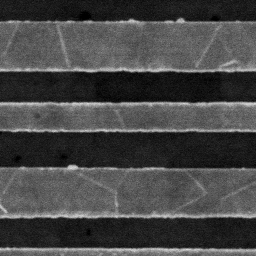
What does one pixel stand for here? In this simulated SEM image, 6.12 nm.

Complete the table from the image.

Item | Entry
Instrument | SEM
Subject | lines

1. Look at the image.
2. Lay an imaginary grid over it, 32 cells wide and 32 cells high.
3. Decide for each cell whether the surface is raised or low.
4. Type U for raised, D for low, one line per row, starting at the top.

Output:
DDDDDDDDDDDDDDDDDDDDDDDDDDDDDDDD
DDDDDDDDDDDDDDDDDDDDDDDDDDDDDDDD
DDDDDDDDDDDDDDDDDDDDDDDDDDDDDDDD
UUUUUUUUUUUUUUUUUUUUUUUUUUUUUUUU
UUUUUUUUUUUUUUUUUUUUUUUUUUUUUUUU
UUUUUUUUUUUUUUUUUUUUUUUUUUUUUUUU
UUUUUUUUUUUUUUUUUUUUUUUUUUUUUUUU
UUUUUUUUUUUUUUUUUUUUUUUUUUUUUUUU
UUUUUUUUUUUUUUUUUUUUUUUUUUUUUUUU
DDDDDDDDDDDDDDDDDDDDDDDDDDDDDDDD
DDDDDDDDDDDDDDDDDDDDDDDDDDDDDDDD
DDDDDDDDDDDDDDDDDDDDDDDDDDDDDDDD
DDDDDDDDDDDDDDDDDDDDDDDDDDDDDDDD
UUUUUUUUUUUUUUUUUUUUUUUUUUUUUUUU
UUUUUUUUUUUUUUUUUUUUUUUUUUUUUUUU
UUUUUUUUUUUUUUUUUUUUUUUUUUUUUUUU
DDDDDDDDDDDDDDDDDDDDDDDDDDDDDDDD
DDDDDDDDDDDDDDDDDDDDDDDDDDDDDDDD
DDDDDDDDDDDDDDDDDDDDDDDDDDDDDDDD
DDDDDDDDDDDDDDDDDDDDDDDDDDDDDDDD
DDDDDDDDDDDDDDDDDDDDDDDDDDDDDDDD
UUUUUUUUUUUUUUUUUUUUUUUUUUUUUUUU
UUUUUUUUUUUUUUUUUUUUUUUUUUUUUUUU
UUUUUUUUUUUUUUUUUUUUUUUUUUUUUUUU
UUUUUUUUUUUUUUUUUUUUUUUUUUUUUUUU
UUUUUUUUUUUUUUUUUUUUUUUUUUUUUUUU
UUUUUUUUUUUUUUUUUUUUUUUUUUUUUUUU
DDDDDDDDDDDDDDDDDDDDDDDDDDDDDDDD
DDDDDDDDDDDDDDDDDDDDDDDDDDDDDDDD
DDDDDDDDDDDDDDDDDDDDDDDDDDDDDDDD
DDDDDDDDDDDDDDDDDDDDDDDDDDDDDDDD
UUUUUUUUUUUUUUUUUUUUUUUUUUUUUUUU